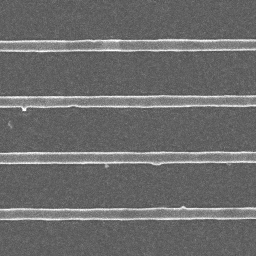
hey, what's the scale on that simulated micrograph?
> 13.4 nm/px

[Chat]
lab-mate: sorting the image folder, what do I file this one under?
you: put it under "parallel lines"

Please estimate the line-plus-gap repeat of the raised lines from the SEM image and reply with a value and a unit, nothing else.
750 nm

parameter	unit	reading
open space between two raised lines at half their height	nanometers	615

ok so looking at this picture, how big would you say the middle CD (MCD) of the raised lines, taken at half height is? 0.142 microns